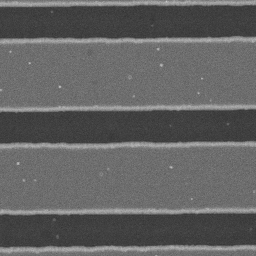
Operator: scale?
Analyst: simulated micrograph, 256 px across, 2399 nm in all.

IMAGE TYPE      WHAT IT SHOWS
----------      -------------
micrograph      lines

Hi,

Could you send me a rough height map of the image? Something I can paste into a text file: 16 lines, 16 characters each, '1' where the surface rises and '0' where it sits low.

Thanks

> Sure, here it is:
0000000000000000
0000000000000000
1111111111111111
1111111111111111
1111111111111111
1111111111111111
1111111111111111
0000000000000000
0000000000000000
1111111111111111
1111111111111111
1111111111111111
1111111111111111
0000000000000000
0000000000000000
0011111111111111